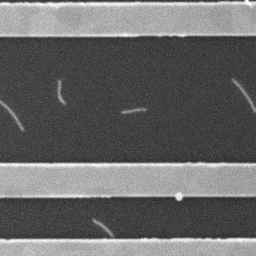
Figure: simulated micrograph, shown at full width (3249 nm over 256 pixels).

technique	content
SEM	lines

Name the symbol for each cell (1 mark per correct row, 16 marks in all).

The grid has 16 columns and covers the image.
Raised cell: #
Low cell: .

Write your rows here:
################
################
................
................
................
................
................
................
................
................
################
################
................
................
................
################